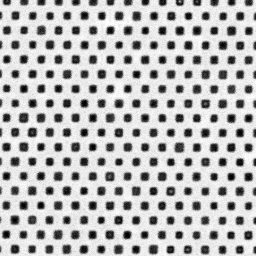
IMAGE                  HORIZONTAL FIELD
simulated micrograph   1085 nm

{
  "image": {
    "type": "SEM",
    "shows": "a regular array of holes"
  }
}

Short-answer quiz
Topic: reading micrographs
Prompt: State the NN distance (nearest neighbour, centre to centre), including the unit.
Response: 70.9 nanometers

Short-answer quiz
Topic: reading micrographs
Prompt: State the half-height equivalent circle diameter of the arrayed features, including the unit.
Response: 9.22 px